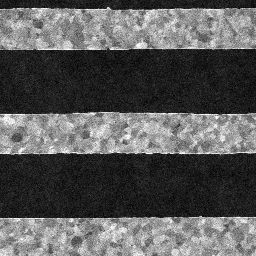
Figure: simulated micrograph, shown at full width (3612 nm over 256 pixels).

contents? one or a few lines or trenches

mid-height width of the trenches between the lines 912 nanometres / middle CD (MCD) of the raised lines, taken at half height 559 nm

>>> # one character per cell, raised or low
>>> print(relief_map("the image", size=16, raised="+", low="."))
................
++++++++++++++++
++++++++++++++++
................
................
................
................
++++++++++++++++
++++++++++++++++
++++++++++++++++
................
................
................
................
++++++++++++++++
++++++++++++++++